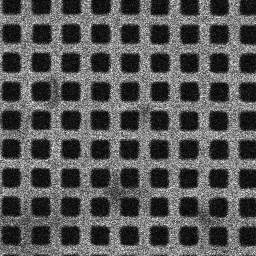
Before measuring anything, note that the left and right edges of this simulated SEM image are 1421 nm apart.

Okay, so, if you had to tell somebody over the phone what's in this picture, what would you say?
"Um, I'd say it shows a regular array of holes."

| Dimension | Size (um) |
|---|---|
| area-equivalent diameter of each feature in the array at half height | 0.122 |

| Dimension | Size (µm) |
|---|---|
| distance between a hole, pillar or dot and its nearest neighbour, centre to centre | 0.159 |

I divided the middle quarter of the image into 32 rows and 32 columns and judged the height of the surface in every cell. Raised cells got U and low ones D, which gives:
DDDDUUUDDDDDUUDDDDDUUDDDDDUUUDDD
DDDDUUUDDDDUUUDDDDDUUUDDDDUUUDDD
UUUUUUUUUUUUUUUUUUUUUUUUUUUUUUUU
UUUUUUUUUUUUUUUUUUUUUUUUUUUUUUUU
DDDDUUUDDDDUUUUDDDUUUUUDDDUUUUDD
DDDDUUUDDDDDUUDDDDDUUUDDDDUUUDDD
DDDDUUUDDDDDUUDDDDDUUDDDDDUUUDDD
DDDDUUUDDDDDUUDDDDDUUDDDDDUUUDDD
DDDDUUUDDDDUUUDDDDDUUUDDDDUUUDDD
DDDUUUUUUUUUUUUDDUUUUUUDDUUUUUDD
UUUUUUUUUUUUUUUUUUUUUUUUUUUUUUUU
DDDUUUUUDDUUUUUUUUUUUUUUUUUUUUUU
DDDDUUUDDDDDUUDDDDDUUUDDDDUUUDDD
DDDDUUDDDDDDUUDDDDDUUDDDDDUUUDDD
DDDDUUDDDDDDUUDDDDDUUDDDDDUUUDDD
DDDDUUUDDDDDUUDDDDDUUDDDDDUUUDDD
DDDDUUUDDDDUUUUDDDUUUUDDDDUUUDDD
UUUUUUUUUUUUUUUUUUUUUUUUUUUUUUUU
UUUUUUUUUUUUUUUUUUUUUUUUUUUUUUUU
DDDDUUUDDDDUUUDDDDDUUUDDDDUUUDDD
DDDDUUDDDDDDUUDDDDDUUDDDDDUUUDDD
DDDDUUDDDDDDUUDDDDDUUDDDDDUUUDDD
DDDDUUDDDDDDUUDDDDDUUDDDDDUUUDDD
DDDDUUUDDDDUUUDDDDDUUUDDDDUUUDDD
UUUUUUUUUUUUUUUUUUUUUUUUUUUUUUUU
UUUUUUUUUUUUUUUUUUUUUUUUUUUUUUUU
DDDDUUUDDDDUUUDDDDDUUUDDDDUUUDDD
DDDDUUDDDDDDUUDDDDDUUDDDDDUUUDDD
DDDDUUDDDDDDUUDDDDDUUDDDDDUUUDDD
DDDDUUUDDDDDUUDDDDDUUDDDDDUUUDDD
DDDDUUUDDDDUUUDDDDDUUUDDDDUUUDDD
UUUUUUUUUUUUUUUUUUUUUUUUUUUUUUUU